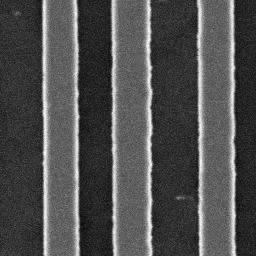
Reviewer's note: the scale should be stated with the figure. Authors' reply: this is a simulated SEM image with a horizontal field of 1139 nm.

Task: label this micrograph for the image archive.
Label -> lines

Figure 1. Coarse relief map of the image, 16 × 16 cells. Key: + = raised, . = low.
...++..++...+++.
...++..++...+++.
...++..++...+++.
...++..++...+++.
...++..++...+++.
...++..++...+++.
...++..++...+++.
...++..++...+++.
...++..++...+++.
...++..++...+++.
...++..++...+++.
...++..++...+++.
...++..++...+++.
...++..++...+++.
...++..++...+++.
...++..++...+++.